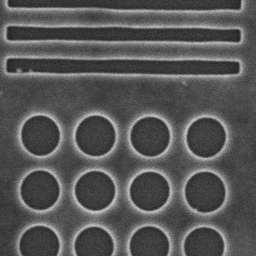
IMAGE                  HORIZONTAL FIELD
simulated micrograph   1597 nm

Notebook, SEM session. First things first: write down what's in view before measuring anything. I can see groups of lines, slits or small figures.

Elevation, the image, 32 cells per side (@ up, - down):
@-----------------------------@@
@@@@@@@@@@@@@@@@@@@@@@@@@@@@@@@@
@@@@@@@@@@@@@@@@@@@@@@@@@@@@@@@@
@-------------------------@@@@@@
@-----------------------------@@
@@@@@@@@@@@@@@@@@@@@@@@@@@@@@@@@
@@@@@@@@@@@@@@@@@@@@@@@@@@@@@@@@
@----------------------------@@@
@-----------------------------@@
@@@@@@@@@@@@@@@@@@@@@@@@@@@@@@@@
@@@@@@@@@@@@@@@@@@@@@@@@@@@@@@@@
@@@@@@@@@@@@@@@@@@@@@@@@@@@@@@@@
@@@@@@@@@@@@@@@@@@@@@@@@@@@@@@@@
@@@@@@@@@@@@@@@@@@@@@@@@@@@@@@@@
@@@@--@@@@@--@@@@@@@@@@@@@@@@@@@
@@@----@@@----@@@----@@@----@@@@
@@@----@@-----@@-----@@-----@@@@
@@@----@@-----@@-----@@-----@@@@
@@@----@@@----@@@----@@@----@@@@
@@@@@-@@@@@--@@@@@--@@@@@--@@@@@
@@@@@@@@@@@@@@@@@@@@@@@@@@@@@@@@
@@@@--@@@@@--@@@@@-@@@@@@-@@@@@@
@@@----@@@----@@@----@@@----@@@@
@@@----@@-----@@-----@@-----@@@@
@@@----@@-----@@-----@@-----@@@@
@@@----@@@----@@@----@@-----@@@@
@@@@@@@@@@@@@@@@@@@@@@@@@-@@@@@@
@@@@@@@@@@@@@@@@@@@@@@@@@@@@@@@@
@@@@--@@@@@--@@@@@--@@@@@-@@@@@@
@@@----@@@----@@-----@@-----@@@@
@@-----@@-----@@-----@@-----@@@@
@@@----@@-----@@-----@@-----@@@@